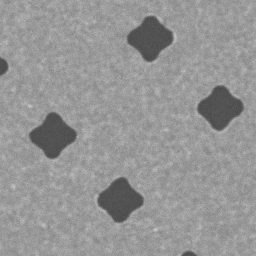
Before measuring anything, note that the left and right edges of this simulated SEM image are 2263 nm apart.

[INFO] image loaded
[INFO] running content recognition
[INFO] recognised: holes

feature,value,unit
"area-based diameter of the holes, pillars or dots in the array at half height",369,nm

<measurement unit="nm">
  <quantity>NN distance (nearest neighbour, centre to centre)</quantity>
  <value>846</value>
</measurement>